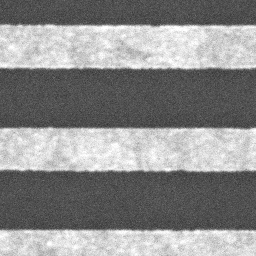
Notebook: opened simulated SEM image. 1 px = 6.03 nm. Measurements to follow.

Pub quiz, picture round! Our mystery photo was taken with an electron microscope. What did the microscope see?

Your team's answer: lines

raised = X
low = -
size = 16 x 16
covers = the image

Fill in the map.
----------------
----------------
XXXXXXXXXXXXXXXX
XXXXXXXXXXXXXXXX
----------------
----------------
----------------
----------------
XXXXXXXXXXXXXXXX
XXXXXXXXXXXXXXXX
XXXXXXXXXXXXXXXX
----------------
----------------
----------------
XXXXXXXXXXXXXXXX
XXXXXXXXXXXXXXXX